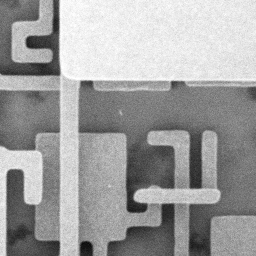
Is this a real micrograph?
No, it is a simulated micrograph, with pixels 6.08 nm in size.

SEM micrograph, wiring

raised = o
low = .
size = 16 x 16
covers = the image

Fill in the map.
....oooooooooooo
....oooooooooooo
....oooooooooooo
....oooooooooooo
....oooooooooooo
................
................
................
................
................
................
................
................
................
................
................